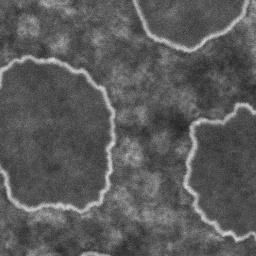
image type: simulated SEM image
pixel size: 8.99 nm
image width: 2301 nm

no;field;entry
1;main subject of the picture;raised bodies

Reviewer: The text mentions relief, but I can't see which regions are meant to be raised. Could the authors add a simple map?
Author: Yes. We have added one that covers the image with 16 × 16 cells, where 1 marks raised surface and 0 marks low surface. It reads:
0000000001111110
0000000001111110
0000000000111000
0000000000000000
1111100000000000
1111110000000000
1111111000000000
1111111000000011
1111111000001111
1111111000001111
1111111000001111
1111111000001111
0111110000001111
0000000000000111
0000000000000011
0000000000000000